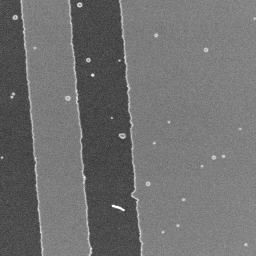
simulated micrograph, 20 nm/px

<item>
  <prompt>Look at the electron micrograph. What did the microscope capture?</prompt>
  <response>one or a few lines or trenches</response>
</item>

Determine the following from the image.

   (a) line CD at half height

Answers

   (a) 1030 nm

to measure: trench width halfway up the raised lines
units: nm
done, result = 941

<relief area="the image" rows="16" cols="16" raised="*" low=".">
*...****........
*...****........
**..****........
**...***........
**...***........
**...***........
**...***........
**...***........
**...***........
**...***........
**...***........
**...***........
**...***........
**...****.......
***...***.......
***...***.......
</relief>